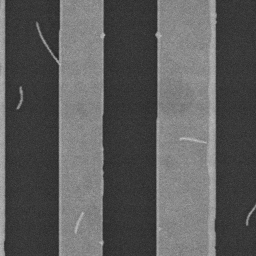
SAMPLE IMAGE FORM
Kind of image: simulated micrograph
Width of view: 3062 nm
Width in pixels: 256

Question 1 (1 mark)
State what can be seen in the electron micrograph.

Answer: lines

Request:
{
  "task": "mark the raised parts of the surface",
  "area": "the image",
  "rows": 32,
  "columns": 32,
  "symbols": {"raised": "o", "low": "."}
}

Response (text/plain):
........ooooo.......ooooooo.....
........ooooo.......ooooooo.....
........ooooo.......ooooooo.....
........ooooo.......ooooooo.....
........ooooo.......ooooooo.....
.......oooooo.......ooooooo.....
.......oooooo.......ooooooo.....
.......oooooo.......ooooooo.....
.......oooooo.......ooooooo.....
.......oooooo.......ooooooo.....
.......oooooo.......ooooooo.....
.......oooooo.......ooooooo.....
.......oooooo.......ooooooo.....
.......oooooo.......ooooooo.....
.......oooooo.......ooooooo.....
.......oooooo.......ooooooo.....
.......oooooo.......ooooooo.....
.......oooooo.......ooooooo.....
.......oooooo.......ooooooo.....
.......oooooo.......ooooooo.....
.......oooooo.......ooooooo.....
.......oooooo.......ooooooo.....
.......oooooo.......ooooooo.....
.......oooooo.......ooooooo.....
.......oooooo.......ooooooo.....
.......oooooo.......ooooooo.....
.......oooooo.......ooooooo.....
.......oooooo.......ooooooo.....
.......oooooo.......ooooooo.....
.......oooooo.......ooooooo.....
.......oooooo.......ooooooo.....
.......oooooo.......ooooooo.....